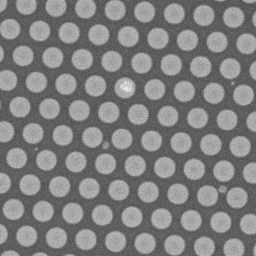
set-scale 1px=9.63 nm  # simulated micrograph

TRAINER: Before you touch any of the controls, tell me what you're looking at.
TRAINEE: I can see an array of small figures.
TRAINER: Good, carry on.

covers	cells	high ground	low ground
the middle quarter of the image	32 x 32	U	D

DDDUUUDDDDUUUUDDDUUUUUDDUUUUUDDD
DDDDDDDDDDDUUDDDDDUUUDDDDUUUUDDD
DDDDDDDDDDDDDDDDDDDDDDDDDDUUDDDD
UUDDDDUUUDDDDDDDDDDDDDDDDDDDDDDD
UUUDDDUUUUDDDUUUUDDDDUUUDDDDDUUD
UUUDDUUUUUDDDUUUUUDDUUUUUDDDUUUU
UUUDDDUUUUDDDUUUUUDDUUUUUDDDUUUU
DDDDDDUUUDDDDUUUUDDDDUUUUDDDUUUU
DDDDDDDDDDDDDDDDDDDDDDUUDDDDUUUU
DDDUUDDDDDDDDDDDDDDDDDDDDDDDDDDD
DDUUUUDDDUUUUDDDDUUUDDDDDDDDDDDD
DUUUUUDDDUUUUUDDUUUUUDDDUUUUDDDD
DUUUUUDDDUUUUUDDUUUUUDDDUUUUDDDU
DDUUUDDDDUUUUDDDUUUUUDDDUUUUDDDU
DDDDDDDDDDDUDDDDDUUUDDDDUUUUDDDU
DDDDDDDDDDDDDDDDDDDDDDDDDDDDDDDD
UUDDDUUUUDDDDDUDDDDDDDDDDDDDDDDD
UUDDDUUUUDDDUUUUUDDDUUUUDDDDUUDD
UUDDDUUUUDDDUUUUUDDDUUUUDDDUUUUD
UDDDDUUUUDDDUUUUUDDDUUUUDDDUUUUU
DDDDDDUUDDDDDUUUDDDDUUUUDDDUUUUU
DDDDDDDDDDDDDDDDDDDDDUUDDDDDUUUD
DDUUUDDDDDDDDDDDDDDDDDDDDDDDDDDD
DUUUUDDDUUUUDDDDUUUDDDDDUUDDDDDD
DUUUUDDDUUUUUDDUUUUUDDDUUUUDDDDU
DUUUUDDDUUUUUDDUUUUUDDDUUUUUDDUU
DDUUUDDDUUUUDDDDUUUUDDDUUUUUDDUU
DDDDDDDDDDDDDDDDUUUDDDDUUUUDDDUU
DDDDDDDDDDDDDDDDDDDDDDDDDDDDDDDU
UDDDUUUUDDDDUUUDDDDDDDDDDDDDDDDD
UDDDUUUUUDDDUUUUDDDUUUUDDDDUUUDD
UDDDUUUUUDDUUUUUDDDUUUUUDDUUUUUD